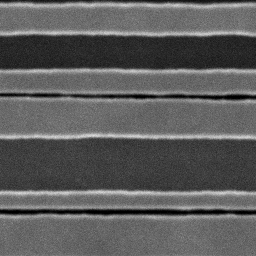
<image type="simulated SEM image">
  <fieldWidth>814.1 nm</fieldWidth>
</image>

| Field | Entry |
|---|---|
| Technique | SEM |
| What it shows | lines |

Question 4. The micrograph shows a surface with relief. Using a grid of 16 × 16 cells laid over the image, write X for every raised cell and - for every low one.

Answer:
XXXXXXXXXXXXXXXX
XXXXXXXXXXXXXXXX
----------------
----------------
XXXXXXXXXXXXXXXX
XXXXXXXXXXXXXXXX
XXXXXXXXXXXXXXXX
XXXXXXXXXXXXXXXX
XXXXXXXXXXXXXXXX
----------------
----------------
----------------
XXXXXXXXXXXXXXXX
XXXXXXXXXXXXXXXX
XXXXXXXXXXXXXXXX
XXXXXXXXXXXXXXXX